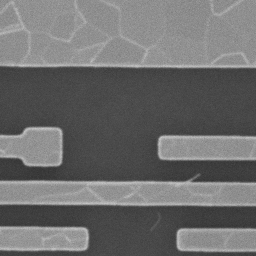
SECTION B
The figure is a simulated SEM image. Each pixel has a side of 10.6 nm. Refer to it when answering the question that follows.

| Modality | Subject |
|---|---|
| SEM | wiring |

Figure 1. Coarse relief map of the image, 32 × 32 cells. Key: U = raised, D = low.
UUUUUUUUUUUUUUUUUUUUUUUUUUUUUUUU
UUUUUUUUUUUUUUUUUUUUUUUUUUUUUUUU
UUUUUUUUUUUUUUUUUUUUUUUUUUUUUUUU
UUUUUUUUUUUUUUUUUUUUUUUUUUUUUUUU
UUUUUUUUUUUUUUUUUUUUUUUUUUUUUUUU
UUUUUUUUUUUUUUUUUUUUUUUUUUUUUUUU
UUUUUUUUUUUUUUUUUUUUUUUUUUUUUUUU
UUUUUUUUUUUUUUUUUUUUUUUUUUUUUUUU
DDDDDDDDDDDDDDDDDDDDDDDDDDDDDDDD
DDDDDDDDDDDDDDDDDDDDDDDDDDDDDDDD
DDDDDDDDDDDDDDDDDDDDDDDDDDDDDDDD
DDDDDDDDDDDDDDDDDDDDDDDDDDDDDDDD
DDDDDDDDDDDDDDDDDDDDDDDDDDDDDDDD
DDDDDDDDDDDDDDDDDDDDDDDDDDDDDDDD
DDDDDDDDDDDDDDDDDDDDDDDDDDDDDDDD
DDDDDDDDDDDDDDDDDDDDDDDDDDDDDDDD
DDDUUUUUDDDDDDDDDDDDDDDDDDDDDDDD
UUUUUUUUDDDDDDDDDDDDUUUUUUUUUUUU
UUUUUUUUDDDDDDDDDDDDUUUUUUUUUUUU
UUUUUUUUDDDDDDDDDDDDUUUUUUUUUUUU
DDDUUUUDDDDDDDDDDDDDDDDDDDDDDDDD
DDDDDDDDDDDDDDDDDDDDDDDDDDDDDDDD
DDDDDDDDDDDDDDDDDDDDDDDDDDDDDDDD
UUUUUUUUUUUUUUUUUUUUUUUUUUUUUUUU
UUUUUUUUUUUUUUUUUUUUUUUUUUUUUUUU
DDDDDDDDDDDDDDDUUUUUUUUUUUUUUUUU
DDDDDDDDDDDDDDDDDDDDDDDDDDDDDDDD
DDDDDDDDDDDDDDDDDDDDDDDDDDDDDDDD
UUUUUDDDDDDDDDDDDDDDDDDDDDDDDDDD
UUUUUUUUUUUDDDDDDDDDDDUUUUUUUUUU
UUUUUUUUUUUDDDDDDDDDDDUUUUUUUUUU
DDDDDDDDDDDDDDDDDDDDDDDDDDDDDDDD